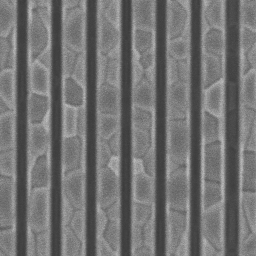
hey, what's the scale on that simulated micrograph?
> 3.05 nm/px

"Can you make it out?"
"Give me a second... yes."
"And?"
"parallel lines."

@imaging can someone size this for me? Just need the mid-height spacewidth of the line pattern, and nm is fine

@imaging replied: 28.3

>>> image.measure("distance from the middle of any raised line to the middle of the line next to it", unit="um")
0.106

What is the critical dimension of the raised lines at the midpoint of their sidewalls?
0.0771 um